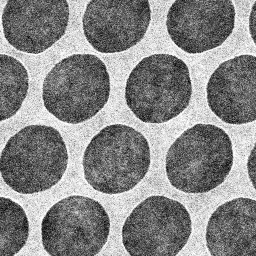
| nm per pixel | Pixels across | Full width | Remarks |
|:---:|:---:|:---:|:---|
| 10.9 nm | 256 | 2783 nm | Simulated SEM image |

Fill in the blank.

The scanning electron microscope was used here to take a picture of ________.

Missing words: holes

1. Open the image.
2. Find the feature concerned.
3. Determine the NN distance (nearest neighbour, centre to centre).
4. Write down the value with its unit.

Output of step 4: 887 nm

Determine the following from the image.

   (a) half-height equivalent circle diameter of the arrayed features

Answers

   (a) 68.9 px